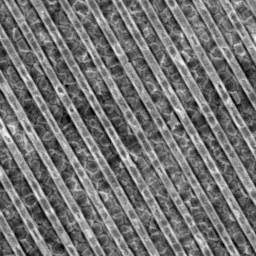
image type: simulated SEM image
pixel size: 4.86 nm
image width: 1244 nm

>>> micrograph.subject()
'parallel lines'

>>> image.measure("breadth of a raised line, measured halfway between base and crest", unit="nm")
41.7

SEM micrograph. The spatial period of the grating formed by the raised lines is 113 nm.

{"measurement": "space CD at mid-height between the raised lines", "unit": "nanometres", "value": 71.8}